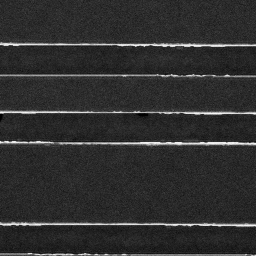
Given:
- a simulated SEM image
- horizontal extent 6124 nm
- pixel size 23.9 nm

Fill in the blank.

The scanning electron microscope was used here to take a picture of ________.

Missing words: lines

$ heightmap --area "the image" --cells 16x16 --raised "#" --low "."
################
################
################
................
................
################
################
................
................
################
################
################
################
################
................
................